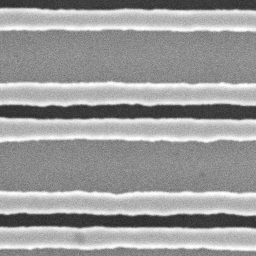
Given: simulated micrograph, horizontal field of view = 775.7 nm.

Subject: lines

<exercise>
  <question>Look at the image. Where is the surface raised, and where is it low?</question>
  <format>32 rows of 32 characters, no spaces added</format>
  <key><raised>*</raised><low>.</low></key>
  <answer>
................................
********************************
********************************
********************************
................................
................................
................................
................................
................................
................................
.****.*...******...........*....
********************************
********************************
................................
................................
********************************
********************************
***...............**.******...*.
................................
................................
................................
................................
................................
................................
********************************
********************************
*******.************************
................................
*.*******..**...................
********************************
********************************
................................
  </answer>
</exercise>